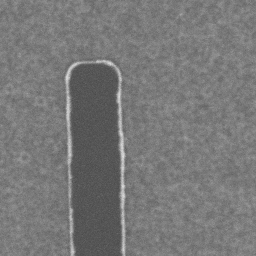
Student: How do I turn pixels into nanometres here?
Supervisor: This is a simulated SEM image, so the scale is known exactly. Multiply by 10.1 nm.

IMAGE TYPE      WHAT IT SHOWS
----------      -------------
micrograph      one or a few lines or trenches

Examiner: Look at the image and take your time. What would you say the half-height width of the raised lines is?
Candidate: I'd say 532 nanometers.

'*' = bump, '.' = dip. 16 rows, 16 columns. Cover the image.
................
................
................
................
....***.........
....***.........
....***.........
....****........
....****........
....****........
....****........
....****........
....****........
....****........
....****........
....****........